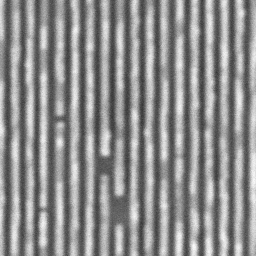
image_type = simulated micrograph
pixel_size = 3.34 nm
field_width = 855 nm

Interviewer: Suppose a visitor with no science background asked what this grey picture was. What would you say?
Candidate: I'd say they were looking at parallel lines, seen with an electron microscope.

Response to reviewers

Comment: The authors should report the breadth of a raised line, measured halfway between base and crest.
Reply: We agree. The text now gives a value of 21.3 nanometers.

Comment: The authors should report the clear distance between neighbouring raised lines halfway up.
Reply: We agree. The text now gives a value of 30.9 nanometers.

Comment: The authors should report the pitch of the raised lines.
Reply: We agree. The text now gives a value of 49.9 nm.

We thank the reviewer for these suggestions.